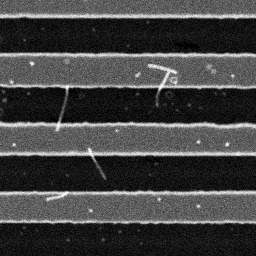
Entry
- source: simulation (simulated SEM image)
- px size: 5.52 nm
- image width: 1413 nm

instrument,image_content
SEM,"lines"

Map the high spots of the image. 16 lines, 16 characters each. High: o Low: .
oooooooooooooooo
................
................
oooooooooooooooo
oooooooooooooooo
....o....oo.oo.o
................
................
oooooooooooooooo
oooooooooooooooo
................
................
oooooooooooooooo
oooooooooooooooo
................
................